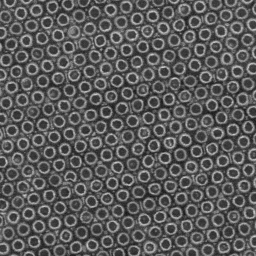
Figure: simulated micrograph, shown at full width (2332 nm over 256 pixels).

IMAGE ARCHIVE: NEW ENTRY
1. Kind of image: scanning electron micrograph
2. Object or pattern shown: a regular array of raised bodies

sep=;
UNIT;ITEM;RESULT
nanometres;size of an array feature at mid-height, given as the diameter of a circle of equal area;105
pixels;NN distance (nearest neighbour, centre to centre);15.7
